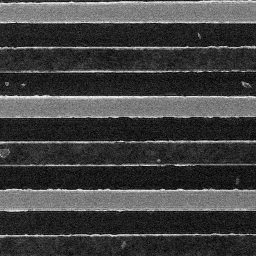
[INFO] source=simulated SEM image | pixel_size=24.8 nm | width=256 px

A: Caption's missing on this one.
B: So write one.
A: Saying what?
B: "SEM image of lines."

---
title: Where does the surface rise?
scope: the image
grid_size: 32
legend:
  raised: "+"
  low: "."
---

..++++++++++++++++++++++++++++++
++++++++++++++++++++++++++++++++
++++++++++++++++++++++++++++++++
................................
................................
................................
++++++++++++++++++++++++++++++++
++++++++++++++++++++++++++++++++
++++++++++++++++++++++++++++++++
................................
................................
................................
++++++++++++++++++++++++++++++++
++++++++++++++++++++++++++++++++
++++++++++++++++++++++++++++++++
................................
................................
................................
++++++++++++++++++++++++++++++++
++++++++++++++++++++++++++++++++
++++++++++++++++++++++++++++++++
................................
................................
................................
++++++++++++++++++++++++++++++++
++++++++++++++++++++++++++++++++
................................
................................
................................
++++++++++++++++++++++++++++++++
++++++++++++++++++++++++++++++++
++++++++++++++++++++++++++++++++